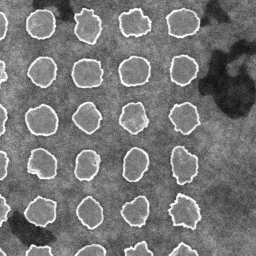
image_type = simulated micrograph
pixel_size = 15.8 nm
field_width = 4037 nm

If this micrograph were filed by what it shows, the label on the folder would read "a regular array of raised bodies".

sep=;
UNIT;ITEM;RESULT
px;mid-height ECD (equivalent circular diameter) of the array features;29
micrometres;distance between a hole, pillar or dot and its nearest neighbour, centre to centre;0.733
